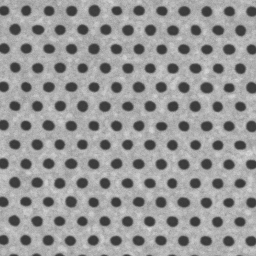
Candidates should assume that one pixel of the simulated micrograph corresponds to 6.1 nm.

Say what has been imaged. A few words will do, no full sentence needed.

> a regular array of holes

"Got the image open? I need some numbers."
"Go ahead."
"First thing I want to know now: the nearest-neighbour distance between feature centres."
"133 nm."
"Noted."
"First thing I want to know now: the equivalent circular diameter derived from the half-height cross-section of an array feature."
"65.6 nm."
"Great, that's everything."